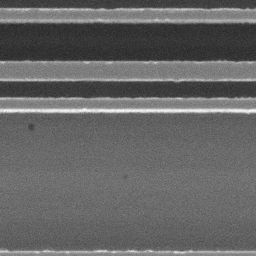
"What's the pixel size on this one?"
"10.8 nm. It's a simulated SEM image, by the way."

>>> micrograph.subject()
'lines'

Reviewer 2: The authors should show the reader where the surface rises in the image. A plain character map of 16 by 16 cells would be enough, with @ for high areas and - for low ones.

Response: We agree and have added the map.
@@@@@@@@@@@@@@@@
----------------
----------------
----------------
@@@@@@@@@@@@@@@@
@@@@@@@@@@@@@@@@
@@@@@@@@@@@@@@@@
----------------
----------------
----------------
----------------
----------------
----------------
----------------
----------------
----------------